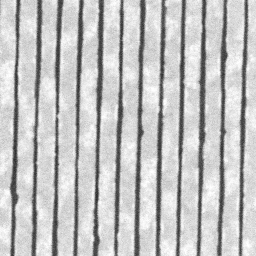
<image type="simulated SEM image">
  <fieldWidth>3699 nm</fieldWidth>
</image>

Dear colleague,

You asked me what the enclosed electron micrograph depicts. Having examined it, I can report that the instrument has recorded parallel lines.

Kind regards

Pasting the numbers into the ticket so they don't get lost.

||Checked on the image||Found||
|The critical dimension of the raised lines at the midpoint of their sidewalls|218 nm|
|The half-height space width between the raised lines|0.0848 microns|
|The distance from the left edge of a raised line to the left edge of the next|0.299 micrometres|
